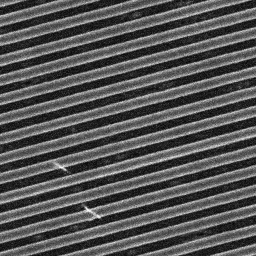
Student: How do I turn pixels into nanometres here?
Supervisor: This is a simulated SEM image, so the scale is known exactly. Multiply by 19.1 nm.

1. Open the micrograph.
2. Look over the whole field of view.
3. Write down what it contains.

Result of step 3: parallel lines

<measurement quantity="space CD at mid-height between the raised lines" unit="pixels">8.58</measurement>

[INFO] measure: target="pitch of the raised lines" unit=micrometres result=0.364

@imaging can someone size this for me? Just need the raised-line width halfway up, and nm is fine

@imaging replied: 196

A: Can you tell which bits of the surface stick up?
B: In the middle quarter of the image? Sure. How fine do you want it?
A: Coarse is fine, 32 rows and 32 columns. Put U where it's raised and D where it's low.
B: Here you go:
UUUDDDDDDDDUUUUUUUUUUDDDDDDDDDUU
DDDDDDDUUUUUUUUUUDDDDDDDDDUUUUUU
DDDDUUUUUUUUUDDDDDDDDDUUUUUUUUUU
UUUUUUUUUUDDDDDDDDUUUUUUUUUUDDDD
UUUUUUDDDDDDDDUUUUUUUUUUDDDDDDDD
UUDDDDDDDDDUUUUUUUUUUDDDDDDDDUUU
DDDDDDDUUUUUUUUUUDDDDDDDDDUUUUUU
DDDUUUUUUUUUUDDDDDDDDDUUUUUUUUUD
UUUUUUUUUDDDDDDDDDUUUUUUUUUUDDDD
UUUUUDDDDDDDDDUUUUUUUUUUDDDDDDDD
UUDDDDDDDDDUUUUUUUUUDDDDDDDDDUUU
DDDDDDDUUUUUUUUUDDDDDDDDDDUUUUUU
DDDUUUUUUUUUDDDDDDDDDDUUUUUUUUUU
UUUUUUUUUDDDDDDDDDUUUUUUUUUUDDDD
UUUUUDDDDDDDDDUUUUUUUUUUDDDDDDDD
UDDDDDDDDDDUUUUUUUUUDDDDDDDDDUUU
DDDDDDDUUUUUUUUUUDDDDDDDDUUUUUUU
DDDUUUUUUUUUUDDDDDDDDUUUUUUUUUUD
UUUUUUUUUDDDDDDDDDUUUUUUUUUDDDDD
UUUUUDDDDDDDDDUUUUUUUUUUDDDDDDDD
UDDDDDDDDDUUUUUUUUUUDDDDDDDDDUUU
DDDDDDUUUUUUUUUUDDDDDDDDDDUUUUUU
DDDUUUUUUUUUDDDDDDDDDDUUUUUUUUUD
UUUUUUUUUDDDDDDDDDUUUUUUUUUDDDDD
UUUUUDDDDDDDDDUUUUUUUUUDDDDDDDDD
UDDDDDDDDDUUUUUUUUUDDDDDDDDDDUUU
DDDDDDDUUUUUUUUUDDDDDDDDDUUUUUUU
DDDUUUUUUUUUDDDDDDDDDUUUUUUUUUUD
UUUUUUUUDDDDDDDDDUUUUUUUUUUDDDDD
UUUUDDDDDDDDDDUUUUUUUUUUDDDDDDDD
UDDDDDDDDDUUUUUUUUUUDDDDDDDDUUUU
DDDDDDUUUUUUUUUUDDDDDDDDDUUUUUUU